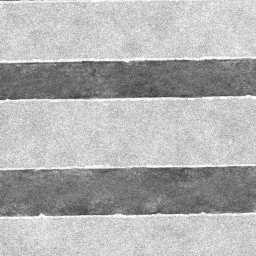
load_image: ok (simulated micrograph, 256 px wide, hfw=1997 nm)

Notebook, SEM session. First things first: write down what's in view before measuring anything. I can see one or a few lines or trenches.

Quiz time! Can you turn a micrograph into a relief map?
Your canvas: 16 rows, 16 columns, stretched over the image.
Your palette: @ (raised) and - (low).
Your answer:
@@@@@@@@@@@@@@@@
@@@@@@@@@@@@@@@@
@@@@@@@@@@@@@@@@
@@@@@@@@@@@@@@@@
----------------
----------------
@@@@@@@@@@@@@@@@
@@@@@@@@@@@@@@@@
@@@@@@@@@@@@@@@@
@@@@@@@@@@@@@@@@
@@@@------------
----------------
----------------
--@--@@@@@@@@@@@
@@@@@@@@@@@@@@@@
@@@@@@@@@@@@@@@@